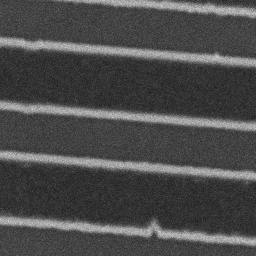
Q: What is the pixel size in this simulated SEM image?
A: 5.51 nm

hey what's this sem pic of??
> one or a few lines or trenches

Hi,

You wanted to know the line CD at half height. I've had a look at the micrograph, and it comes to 363 nm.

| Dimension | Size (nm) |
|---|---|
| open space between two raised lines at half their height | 264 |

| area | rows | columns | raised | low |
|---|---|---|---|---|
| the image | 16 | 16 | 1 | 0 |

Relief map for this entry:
0000000000001111
0000000000000000
0000000000000000
1111111111100000
1111111111111111
1111111111111111
1111111111111111
0000000000011111
0000000000000000
0000000000000000
1111111111000000
1111111111111111
1111111111111111
1111111111111111
0000000000111111
0000000000000000